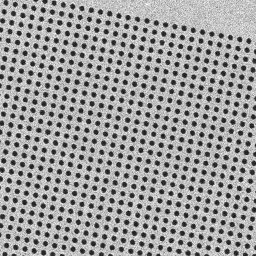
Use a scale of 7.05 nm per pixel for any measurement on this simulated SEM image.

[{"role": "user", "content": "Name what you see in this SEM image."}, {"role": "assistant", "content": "a regular array of holes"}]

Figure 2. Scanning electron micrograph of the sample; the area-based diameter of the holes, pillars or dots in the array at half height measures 0.0365 um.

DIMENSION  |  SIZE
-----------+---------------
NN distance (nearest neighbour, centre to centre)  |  0.0635 microns